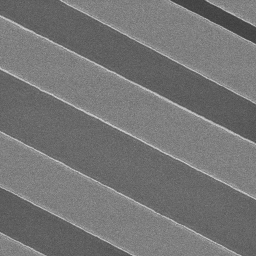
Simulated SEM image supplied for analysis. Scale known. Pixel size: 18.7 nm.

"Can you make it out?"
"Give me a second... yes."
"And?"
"lines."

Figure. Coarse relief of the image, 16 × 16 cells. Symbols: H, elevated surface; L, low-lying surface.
LLLLLHHHHHHHLLHH
HLLLLLLHHHHHHHLL
HHHLLLLLHHHHHHHL
HHHHHLLLLLHHHHHH
HHHHHHHLLLLLHHHH
LLHHHHHHHLLLLLHH
LLLLHHHHHHHLLLLL
LLLLLLHHHHHHHLLL
HLLLLLLLHHHHHHHL
HHHLLLLLLLHHHHHH
HHHHLLLLLLLLHHHH
HHHHHHLLLLLLLLHH
LLHHHHHHLLLLLLLL
LLLLHHHHHHLLLLLL
LLLLLHHHHHHHLLLL
HHLLLLLHHHHHHHLL